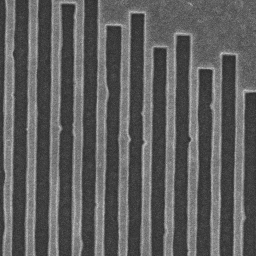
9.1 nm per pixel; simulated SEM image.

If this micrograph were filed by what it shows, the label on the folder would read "parallel lines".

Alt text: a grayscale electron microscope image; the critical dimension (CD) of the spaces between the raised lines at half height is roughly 131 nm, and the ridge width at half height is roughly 73.9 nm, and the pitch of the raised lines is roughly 210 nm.